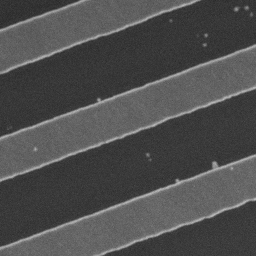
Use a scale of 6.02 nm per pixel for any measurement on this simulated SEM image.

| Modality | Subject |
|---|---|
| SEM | lines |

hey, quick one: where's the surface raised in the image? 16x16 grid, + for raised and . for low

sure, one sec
....+++++++.....
.++++++++.......
++++++..........
+++...........++
...........+++++
.........+++++++
......+++++++...
...+++++++......
++++++++........
+++++...........
++............++
...........+++++
........++++++++
.....++++++++...
...+++++++......
++++++++........